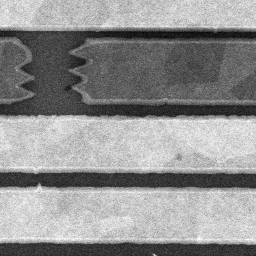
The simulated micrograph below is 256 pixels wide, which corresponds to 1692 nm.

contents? one or a few lines or trenches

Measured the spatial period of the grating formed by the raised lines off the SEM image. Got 476 nanometres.